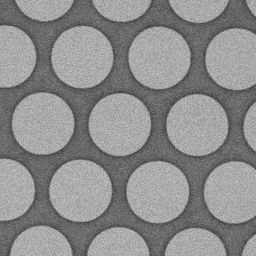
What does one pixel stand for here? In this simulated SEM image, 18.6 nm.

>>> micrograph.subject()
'an array of small figures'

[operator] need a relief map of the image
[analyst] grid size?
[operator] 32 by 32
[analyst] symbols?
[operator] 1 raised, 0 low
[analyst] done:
00111111100011111110011111110001
00011111000011111100001111110001
00001110000000111000000111000000
11000000011100000001100000000000
11110001111110000111111000011111
11110001111111000111111000111111
11110011111111001111111100111111
11110011111111001111111100111111
11110001111111001111111100111111
11110001111110000111111000111111
11000000111100000011110000011111
00000000000000000000000000000000
00011111000001111000001111100000
00111111100011111100001111110001
00111111100111111110011111110001
00111111100111111110011111110011
00111111100111111110011111110001
00111111100011111100011111110001
00011111000011111000001111100000
00000000000000000000000000000000
11100000111100000011100000001110
11110001111110000111111000011111
11110011111111001111111000111111
11110011111111001111111100111111
11110011111111001111111100111111
11110001111111001111111000111111
11100001111110000111111000111111
10000000011000000011100000001110
00001110000000110000000000000000
00111111000011111100001111100000
00111111100111111100011111110001
01111111100111111110011111110011